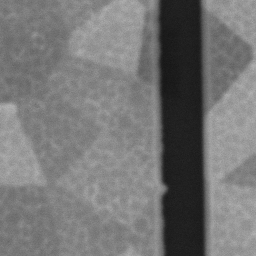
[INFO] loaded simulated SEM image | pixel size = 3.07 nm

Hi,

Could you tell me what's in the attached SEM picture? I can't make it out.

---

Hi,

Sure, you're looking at one or a few lines or trenches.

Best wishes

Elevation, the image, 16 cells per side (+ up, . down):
++++++++++...+++
++++++++++...+++
++++++++++...+++
++++++++++...+++
++++++++++...+++
++++++++++...+++
++++++++++...+++
++++++++++...+++
++++++++++...+++
++++++++++...+++
++++++++++...+++
++++++++++...+++
++++++++++...+++
++++++++++...+++
++++++++++...+++
++++++++++...+++